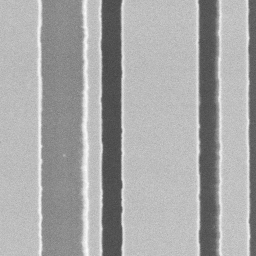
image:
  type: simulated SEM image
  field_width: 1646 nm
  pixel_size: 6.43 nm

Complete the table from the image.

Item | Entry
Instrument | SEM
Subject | lines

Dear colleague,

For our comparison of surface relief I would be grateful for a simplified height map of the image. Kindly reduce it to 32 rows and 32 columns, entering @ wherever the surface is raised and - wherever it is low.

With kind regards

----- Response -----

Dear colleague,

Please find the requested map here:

@@@@@------@@--@@@@@@@@@@--@@@@-
@@@@@------@@--@@@@@@@@@@--@@@@-
@@@@@------@@--@@@@@@@@@@--@@@@-
@@@@@------@@--@@@@@@@@@@--@@@@-
@@@@@------@@--@@@@@@@@@@--@@@@-
@@@@@------@@--@@@@@@@@@@--@@@@-
@@@@@------@@--@@@@@@@@@@--@@@@-
@@@@@------@@--@@@@@@@@@@--@@@@-
@@@@@------@@--@@@@@@@@@@--@@@@-
@@@@@------@@--@@@@@@@@@@--@@@@-
@@@@@------@@--@@@@@@@@@@--@@@@-
@@@@@------@@--@@@@@@@@@@--@@@@-
@@@@@------@@--@@@@@@@@@@--@@@@-
@@@@@------@@--@@@@@@@@@@--@@@@-
@@@@@------@@--@@@@@@@@@@--@@@@-
@@@@@------@@--@@@@@@@@@@--@@@@-
@@@@@------@@--@@@@@@@@@@--@@@@-
@@@@@------@@--@@@@@@@@@@--@@@@-
@@@@@------@@--@@@@@@@@@@--@@@@-
@@@@@------@@--@@@@@@@@@@--@@@@-
@@@@@------@@--@@@@@@@@@@--@@@@-
@@@@@------@@--@@@@@@@@@@--@@@@-
@@@@@------@@--@@@@@@@@@@--@@@@-
@@@@@------@@--@@@@@@@@@@--@@@@-
@@@@@------@@--@@@@@@@@@@--@@@@-
@@@@@------@@--@@@@@@@@@@--@@@@-
@@@@@------@@--@@@@@@@@@@--@@@@-
@@@@@------@@--@@@@@@@@@@--@@@@-
@@@@@------@@--@@@@@@@@@@--@@@@-
@@@@@------@@--@@@@@@@@@@--@@@@-
@@@@@------@@--@@@@@@@@@@--@@@@-
@@@@@------@@--@@@@@@@@@@--@@@@-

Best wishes